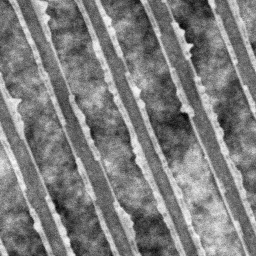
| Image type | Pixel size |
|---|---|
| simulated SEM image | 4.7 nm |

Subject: parallel lines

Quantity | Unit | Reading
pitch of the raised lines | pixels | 60.9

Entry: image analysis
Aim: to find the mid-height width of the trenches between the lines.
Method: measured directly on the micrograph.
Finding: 174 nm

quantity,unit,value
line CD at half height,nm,112